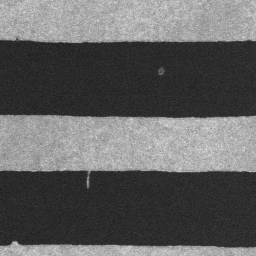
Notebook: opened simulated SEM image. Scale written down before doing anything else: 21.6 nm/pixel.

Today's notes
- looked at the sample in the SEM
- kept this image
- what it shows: one or a few lines or trenches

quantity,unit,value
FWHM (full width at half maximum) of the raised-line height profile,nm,1090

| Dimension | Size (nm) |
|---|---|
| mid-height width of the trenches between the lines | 1630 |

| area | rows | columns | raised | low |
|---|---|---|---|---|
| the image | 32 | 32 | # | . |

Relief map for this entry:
################################
################################
################################
################################
################################
................................
................................
................................
................................
................................
................................
................................
................................
................................
########........................
################################
################################
################################
################################
################################
################################
................................
................................
................................
................................
................................
................................
................................
................................
................................
.#..............................
################################